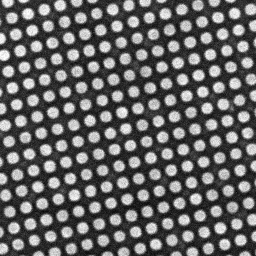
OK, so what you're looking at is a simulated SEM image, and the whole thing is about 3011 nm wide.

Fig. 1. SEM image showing a regular array of raised bodies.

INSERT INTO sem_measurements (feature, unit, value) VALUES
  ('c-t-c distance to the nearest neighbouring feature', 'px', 16.6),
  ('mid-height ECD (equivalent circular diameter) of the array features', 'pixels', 10.5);